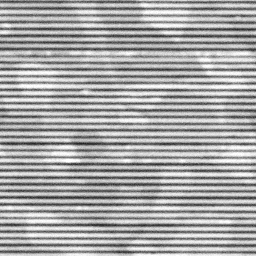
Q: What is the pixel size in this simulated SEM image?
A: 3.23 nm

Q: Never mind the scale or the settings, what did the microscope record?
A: parallel lines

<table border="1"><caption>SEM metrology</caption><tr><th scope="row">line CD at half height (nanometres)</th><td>11.7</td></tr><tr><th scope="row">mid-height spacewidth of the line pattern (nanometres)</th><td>8.9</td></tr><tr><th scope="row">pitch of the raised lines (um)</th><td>0.0218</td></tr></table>